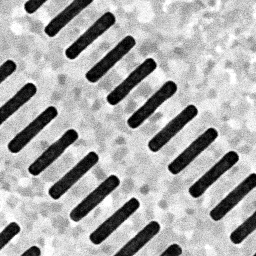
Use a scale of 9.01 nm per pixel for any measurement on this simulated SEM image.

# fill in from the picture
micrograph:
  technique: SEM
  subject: a regular array of holes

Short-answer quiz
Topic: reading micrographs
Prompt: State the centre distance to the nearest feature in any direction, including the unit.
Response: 277 nm